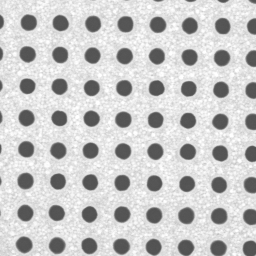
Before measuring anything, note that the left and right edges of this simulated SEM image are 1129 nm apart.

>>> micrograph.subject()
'a regular array of holes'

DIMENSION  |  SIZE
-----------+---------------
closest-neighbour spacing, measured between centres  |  0.139 µm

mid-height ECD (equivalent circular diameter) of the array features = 0.0684 microns